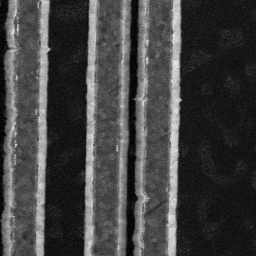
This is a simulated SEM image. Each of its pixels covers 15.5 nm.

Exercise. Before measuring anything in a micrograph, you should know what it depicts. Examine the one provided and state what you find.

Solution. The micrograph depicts one or a few lines or trenches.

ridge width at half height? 515 nm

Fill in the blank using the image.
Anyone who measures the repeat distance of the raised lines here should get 1.02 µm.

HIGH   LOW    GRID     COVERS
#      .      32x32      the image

..####......####..####..........
..###.......####..####..........
.####.......####..####..........
.####.......####..####..........
.####.......####..####..........
.#####......####..####..........
.#####......####..####..........
.####.......####..####..........
.####.......####..####..........
.####......#####..####..........
.####......#####..####..........
.####......#####..####..........
.####......####...####..........
.####......####...####..........
..###......####...####..........
.####......####...####..........
.####......#####..####..........
.####......#####..####..........
.####......####...####..........
.####......####..#####..........
.####......####..#####..........
.####......####..#####..........
.####......####...####..........
.####......####..#####..........
.####......####...####..........
.####......####..####...........
.####......####..####...........
.####......####..####...........
.####......####..####...........
.####......####..####...........
.####......####..####...........
.####......####..####...........